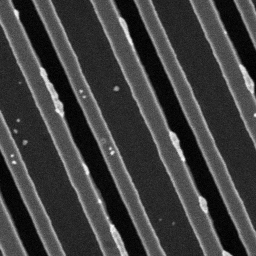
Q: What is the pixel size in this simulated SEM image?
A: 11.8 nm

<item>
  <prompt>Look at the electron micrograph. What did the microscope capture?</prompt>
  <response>lines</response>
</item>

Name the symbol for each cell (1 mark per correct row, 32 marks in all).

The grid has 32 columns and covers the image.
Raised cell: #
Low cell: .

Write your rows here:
##..###.....##...##.....###..###
##...##.....###..###....###...##
##...##.....###...##.....###..##
###...##.....###..##.....###...#
.##...##.....###...##.....##...#
.###...##.....###..##.....###...
..##...##.....###...##.....##...
..###...##.....##...##.....###..
...##...##.....###...##.....###.
...###..##......##...##.....###.
....##...##.....###..###....####
....###..##.....###...##.....###
....###...##.....###..##.....###
.....###..##.....###...##.....##
.....###...##.....##...##.....##
#.....##...##.....###...##.....#
#.....###...##.....###..##.....#
##.....##...##.....###...##.....
##.....###..###.....###..##.....
###....###...##.....###..###....
.##.....###..##.....###...##....
.##.....###...##.....###..##....
..##.....##...##.....###...##...
..##.....###...##.....##...##...
...##.....##...##.....###...##..
#..##.....###...##.....###..##..
#...##.....##...##.....###...##.
#...##.....###...##.....##...##.
##..###.....##...##.....###...##
##...##.....###..###.....##...##
###..##.....###...##.....###..##
###...##.....###..##.....###...#